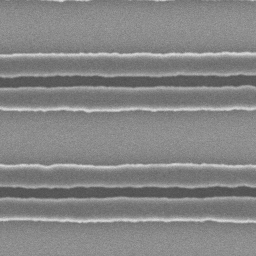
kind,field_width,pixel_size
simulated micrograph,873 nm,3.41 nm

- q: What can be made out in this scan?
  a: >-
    lines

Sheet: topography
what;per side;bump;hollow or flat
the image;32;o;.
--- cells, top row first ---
................................
................................
................................
................................
................................
................................
................................
oooooooooooooooooooooooooooooooo
oooooooooooooooooooooooooooooooo
ooo.oo.......oo....oo...........
................................
oooooooooooooooooooooooooooooooo
oooooooooooooooooooooooooooooooo
oooooooooooooooooooooooooooooooo
................................
................................
................................
................................
................................
................................
.....................ooo........
oooooooooooooooooooooooooooooooo
oooooooooooooooooooooooooooooooo
...oo.o.o..............oo.......
................................
oooooooooooooooooooooooooooooooo
oooooooooooooooooooooooooooooooo
o...oooooooooooooooooooooooooooo
................................
................................
................................
................................